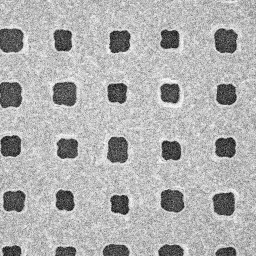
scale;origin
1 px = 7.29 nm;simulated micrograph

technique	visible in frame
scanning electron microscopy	a regular array of holes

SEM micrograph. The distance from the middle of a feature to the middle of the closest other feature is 374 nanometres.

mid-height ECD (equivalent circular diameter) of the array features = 0.169 micrometres